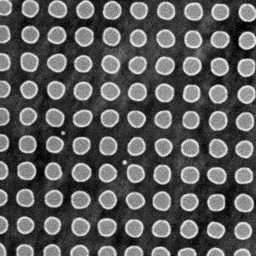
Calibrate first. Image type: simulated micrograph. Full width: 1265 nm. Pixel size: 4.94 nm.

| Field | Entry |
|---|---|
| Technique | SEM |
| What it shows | an array of small figures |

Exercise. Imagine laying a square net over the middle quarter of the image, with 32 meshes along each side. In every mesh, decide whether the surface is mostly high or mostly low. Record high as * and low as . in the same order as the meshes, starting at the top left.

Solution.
...****...****..****...****...**
...***....***....***...****...**
........................**.....*
................................
................................
...****...***....***....***....*
...****..*****..*****..****...**
...****..*****..*****..****...**
...***....***....***...****...**
...............................*
................................
................................
...****..*****..****...****...**
..*****..*****..****...****...**
..*****..****...****...****...**
....*.....**.....**.....**....**
................................
................................
....*.....**.....**.............
..****...****....***...***....**
..****...****...****...****..***
..****...****...****...****..***
....*.....**.....**.....**....**
................................
................................
...***....**....***.....**......
..*****..****...****...***....**
..*****..****...****..*****..***
..****...****...****...****..***
.................*.....***....**
................................
................................